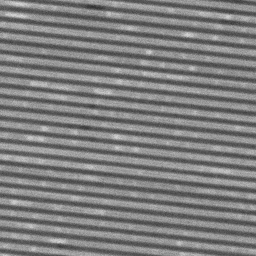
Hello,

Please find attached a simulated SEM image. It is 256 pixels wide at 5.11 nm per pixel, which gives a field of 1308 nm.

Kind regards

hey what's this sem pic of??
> parallel lines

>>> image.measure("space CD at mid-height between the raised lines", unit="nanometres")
31.7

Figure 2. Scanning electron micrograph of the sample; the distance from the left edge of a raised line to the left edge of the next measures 56.1 nm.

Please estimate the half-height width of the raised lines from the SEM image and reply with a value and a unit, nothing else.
4.46 pixels